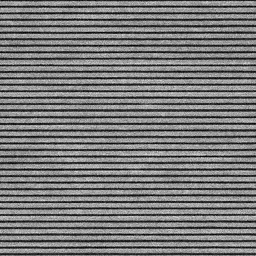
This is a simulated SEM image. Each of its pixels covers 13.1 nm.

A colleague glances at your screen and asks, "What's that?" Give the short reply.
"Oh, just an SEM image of parallel lines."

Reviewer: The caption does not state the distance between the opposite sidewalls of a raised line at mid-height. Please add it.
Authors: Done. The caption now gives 4.38 pixels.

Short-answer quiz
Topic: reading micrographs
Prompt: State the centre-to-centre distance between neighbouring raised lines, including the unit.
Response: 84.9 nm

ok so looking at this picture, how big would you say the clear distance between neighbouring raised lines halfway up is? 22.8 nanometres